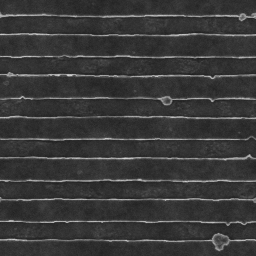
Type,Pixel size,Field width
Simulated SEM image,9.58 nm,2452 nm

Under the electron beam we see parallel lines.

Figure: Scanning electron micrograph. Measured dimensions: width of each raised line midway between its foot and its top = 0.222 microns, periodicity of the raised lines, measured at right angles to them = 395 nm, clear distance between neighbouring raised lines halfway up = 0.17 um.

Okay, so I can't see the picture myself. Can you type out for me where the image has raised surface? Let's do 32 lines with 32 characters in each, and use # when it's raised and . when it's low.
################################
################################
................................
................................
################################
################################
################################
................................
................................
###############...########.#####
################################
################################
....................##....#.....
................................
................................
################################
################################
................................
................................
................................
################################
################################
################################
................................
................................
################################
################################
################################
................................
...........................#....
################################
################################